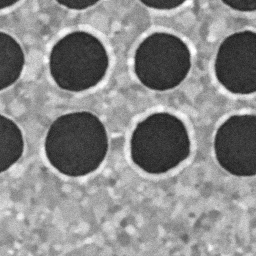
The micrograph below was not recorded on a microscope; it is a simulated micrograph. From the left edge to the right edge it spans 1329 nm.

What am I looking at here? holes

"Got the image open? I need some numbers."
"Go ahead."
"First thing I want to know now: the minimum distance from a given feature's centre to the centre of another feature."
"425 nanometres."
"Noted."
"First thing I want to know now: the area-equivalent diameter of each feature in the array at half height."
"320 nm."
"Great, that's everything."